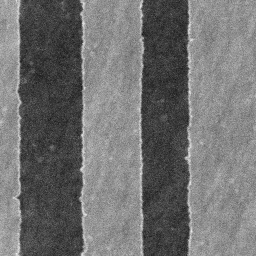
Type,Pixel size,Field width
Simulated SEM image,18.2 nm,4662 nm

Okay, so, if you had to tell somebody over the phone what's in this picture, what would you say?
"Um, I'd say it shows one or a few lines or trenches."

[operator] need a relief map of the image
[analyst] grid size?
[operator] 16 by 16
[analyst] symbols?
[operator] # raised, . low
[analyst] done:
.####....###....
.####....###....
.####....###....
.####....###....
.####....###....
.####....###....
.####....###....
.####....###....
.####....###....
.####....###....
.####....###....
.####....###....
.####....###....
.####....###....
.####....###....
.####....###....